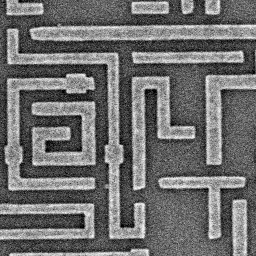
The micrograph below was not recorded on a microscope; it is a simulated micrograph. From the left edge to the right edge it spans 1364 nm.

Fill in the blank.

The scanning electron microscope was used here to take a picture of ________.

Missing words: wiring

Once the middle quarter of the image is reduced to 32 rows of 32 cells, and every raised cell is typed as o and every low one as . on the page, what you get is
...........ooo..................
...........ooo..................
...........ooo..................
ooooooo....ooo...ooooooooo......
ooooooo....ooo...ooooooooo......
oooooooo...oo....ooooooooo......
.ooooo.....ooo...ooo...ooo......
...........ooo...ooo...ooo......
...........ooo...ooo...ooo......
...........ooo...ooo...ooo......
oooooooo...ooo...ooo...ooo......
oooooooo...ooo...ooo...ooo......
oooooooo...ooo...ooo...ooo......
.....ooo...ooo...ooo...ooo......
.....ooo...ooo...ooo...ooo......
.....ooo...ooo...ooo...oooo.....
o....ooo...ooo...ooo...ooooooooo
o....ooo...ooo...ooo....oooooooo
o....ooo...ooo...ooo............
.....ooo...ooo...ooo............
.....ooo..ooooo..ooo............
.....ooo..ooooo..ooo............
oooooooo..ooooo..ooo............
oooooooo..ooooo..ooo............
oooooooo...ooo...ooo............
...........ooo...ooo............
...........ooo...ooo............
...........ooo...ooo............
...........ooo...ooo.........ooo
oooooooo...ooo...ooo....oooooooo
oooooooo...ooo...ooo....oooooooo
............oo..................